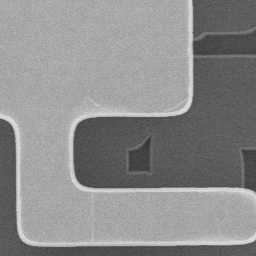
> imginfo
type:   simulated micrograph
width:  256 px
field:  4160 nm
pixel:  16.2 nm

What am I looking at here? wiring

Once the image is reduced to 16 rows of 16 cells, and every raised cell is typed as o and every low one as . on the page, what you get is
oooooooooooo....
oooooooooooo....
oooooooooooo....
oooooooooooo....
oooooooooooo....
oooooooooooo....
oooooooooooo....
ooooo...........
.oooo...........
.ooo............
.oooo...........
.oooo...........
.ooooooooooooooo
.ooooooooooooooo
.ooooooooooooooo
................